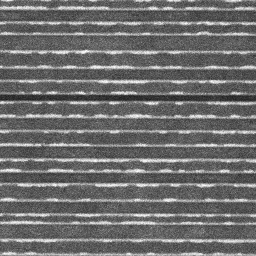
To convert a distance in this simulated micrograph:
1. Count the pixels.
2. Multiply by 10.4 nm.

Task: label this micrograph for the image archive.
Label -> parallel lines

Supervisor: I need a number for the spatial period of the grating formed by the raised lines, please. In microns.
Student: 0.284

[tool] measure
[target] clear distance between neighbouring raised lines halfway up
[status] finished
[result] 134 nanometres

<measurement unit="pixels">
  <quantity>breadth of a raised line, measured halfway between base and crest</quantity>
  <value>15.4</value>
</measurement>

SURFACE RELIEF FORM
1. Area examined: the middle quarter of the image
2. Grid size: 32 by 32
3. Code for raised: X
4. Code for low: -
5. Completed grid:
XXXXXXXXXXXXXXXXXXXXXXXXXXXXXXXX
--------------------------------
--------------------------------
--------------------------------
XXXXXXXXXXXXXXXXXXXXXXXXXXXXXXXX
XXXXXXXXXXXXXXXXXXXXXXXXXXXXXXXX
XXXXXXXXXXXXXXXXXXXXXXXXXXXXXXXX
-----------XXXXXXXXXXXXXXXXXXXXX
--------------------------------
XXXXXXXXXXXXXXXXXXXXXXXXXX------
XXXXXXXXXXXXXXXXXXXXXXXXXXXXXXXX
XXXXXXXXXXXXXXXXXXXXXXXXXXXXXXXX
XXXXXXXXXXXXXXXXXXXXXXXXXXXXXXXX
--------------------------------
--------------------------------
--------------------------------
--------------------------------
XXXXXXXXXXXXXXXXXXXXXXXXXXXXXXXX
XXXXXXXXXXXXXXXXXXXXXXXXXXXXXXXX
XXXXXXXXXXXXXXXXXXXXXXXXXXXXXXXX
--------------------------------
--------------------------------
--------------------------------
--------------------------------
XXXXXXXXXXXXXXXXXXXXXXXXXXXXXXXX
XXXXXXXXXXXXXXXXXXXXXXXXXXXXXXXX
XXXXXXXXXXXXXXXXXXXXXXXXXXXXXXXX
--------------------------------
--------------------------------
--------------------------------
XXXXXXXXXXXXXXXXXXXXXXXXXXXXXXXX
XXXXXXXXXXXXXXXXXXXXXXXXXXXXXXXX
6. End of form